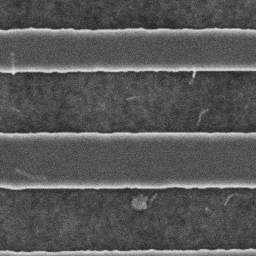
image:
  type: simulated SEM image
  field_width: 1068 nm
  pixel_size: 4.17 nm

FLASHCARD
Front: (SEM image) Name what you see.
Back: lines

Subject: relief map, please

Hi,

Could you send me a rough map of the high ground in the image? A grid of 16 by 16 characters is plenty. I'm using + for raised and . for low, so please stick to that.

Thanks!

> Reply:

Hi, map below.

................
................
++++++++++++++++
++++++++++++++++
+.++............
................
................
................
++++++++++++++++
++++++++++++++++
++++++++++++++++
++++++++++++++++
................
................
................
................